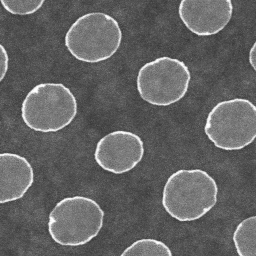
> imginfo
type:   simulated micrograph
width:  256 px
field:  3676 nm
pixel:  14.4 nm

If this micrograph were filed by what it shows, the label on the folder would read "raised bodies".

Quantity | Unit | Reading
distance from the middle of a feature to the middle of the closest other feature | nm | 1180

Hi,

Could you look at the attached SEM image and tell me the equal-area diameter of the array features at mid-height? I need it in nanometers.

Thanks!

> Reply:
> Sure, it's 736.